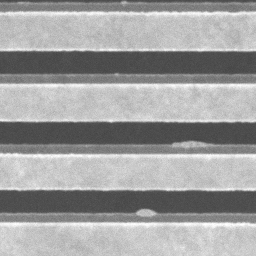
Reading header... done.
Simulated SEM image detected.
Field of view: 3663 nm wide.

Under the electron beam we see lines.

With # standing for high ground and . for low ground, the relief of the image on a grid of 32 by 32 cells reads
################################
################################
################################
################################
################################
################################
................................
................................
................................
################################
################################
################################
################################
################################
################################
................................
................................
................................
################################
################################
################################
################################
################################
################################
................................
................................
.................##.............
################################
################################
################################
################################
################################